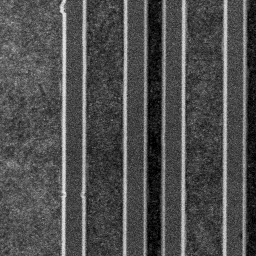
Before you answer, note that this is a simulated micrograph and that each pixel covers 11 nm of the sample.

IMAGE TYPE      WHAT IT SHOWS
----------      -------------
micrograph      parallel lines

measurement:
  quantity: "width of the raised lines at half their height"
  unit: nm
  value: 233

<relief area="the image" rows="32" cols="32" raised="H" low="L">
LLLLLLLLHHHLLLLLHHLLHHHLLLLLHHHL
LLLLLLLLHHHLLLLLHHLLHHHLLLLLHHHL
LLLLLLLLHHHLLLLLHHLLHHHLLLLLHHHL
LLLLLLLLHHHLLLLLHHLLHHHLLLLLHHHL
LLLLLLLLHHHLLLLLHHLLHHHLLLLLHHHL
LLLLLLLLHHHLLLLLHHLLHHHLLLLLHHHL
LLLLLLLLHHHLLLLLHHLLHHHLLLLLHHHL
LLLLLLLLHHHLLLLLHHLLHHHLLLLLHHHL
LLLLLLLLHHHLLLLLHHLLHHHLLLLLHHHL
LLLLLLLLHHHLLLLLHHLLHHHLLLLLHHHL
LLLLLLLLHHHLLLLLHHLLHHHLLLLLHHHL
LLLLLLLLHHHLLLLLHHLLHHHLLLLLHHHL
LLLLLLLLHHHLLLLLHHLLHHHLLLLLHHHL
LLLLLLLLHHHLLLLLHHLLHHHLLLLLHHHL
LLLLLLLLHHHLLLLLHHLLHHHLLLLLHHHL
LLLLLLLLHHLLLLLLHHLLHHHLLLLLHHHL
LLLLLLLLHHLLLLLLHHLLHHHLLLLLHHHL
LLLLLLLLHHLLLLLLHHLLHHHLLLLLHHHL
LLLLLLLLHHLLLLLLHHLLHHHLLLLLHHHL
LLLLLLLLHHLLLLLLHHLLHHHLLLLLHHHL
LLLLLLLLHHLLLLLLHHLLHHHLLLLLHHHL
LLLLLLLLHHLLLLLLHHLLHHHLLLLLHHHL
LLLLLLLLHHLLLLLLHHLLHHHLLLLLHHHL
LLLLLLLLHHLLLLLLHHLLHHHLLLLLHHHL
LLLLLLLLHHLLLLLLHHLLHHHLLLLLHHHL
LLLLLLLLHHLLLLLLHHLLHHHLLLLLHHHL
LLLLLLLLHHLLLLLLHHLLHHHLLLLLHHHL
LLLLLLLLHHLLLLLLHHLLHHHLLLLLHHHL
LLLLLLLLHHLLLLLLHHLLHHHLLLLLHHHL
LLLLLLLLHHLLLLLLHHLLHHHLLLLLHHHL
LLLLLLLLHHLLLLLLHHLLHHHLLLLLHHHL
LLLLLLLLHHLLLLLLHHLLHHHLLLLLHHHL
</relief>